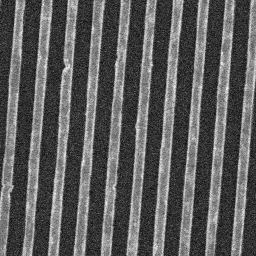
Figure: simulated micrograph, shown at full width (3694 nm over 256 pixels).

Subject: parallel lines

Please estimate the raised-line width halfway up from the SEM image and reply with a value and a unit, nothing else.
133 nm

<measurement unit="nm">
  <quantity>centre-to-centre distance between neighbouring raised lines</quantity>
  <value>376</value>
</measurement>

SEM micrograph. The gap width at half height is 241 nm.